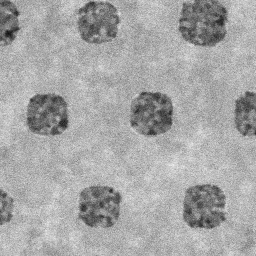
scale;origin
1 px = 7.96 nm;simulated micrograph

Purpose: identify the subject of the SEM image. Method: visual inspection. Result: raised bodies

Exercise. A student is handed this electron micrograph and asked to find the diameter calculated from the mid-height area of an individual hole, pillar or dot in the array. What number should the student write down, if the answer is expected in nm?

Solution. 369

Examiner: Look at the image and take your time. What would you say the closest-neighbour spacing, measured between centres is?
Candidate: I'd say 831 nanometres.